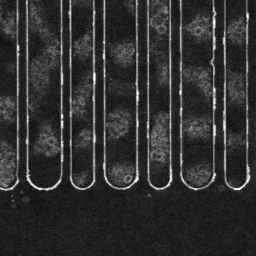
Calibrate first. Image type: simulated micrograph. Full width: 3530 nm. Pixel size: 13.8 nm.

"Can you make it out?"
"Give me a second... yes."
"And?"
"parallel lines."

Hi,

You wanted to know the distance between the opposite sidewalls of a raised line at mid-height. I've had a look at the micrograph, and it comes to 157 nm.